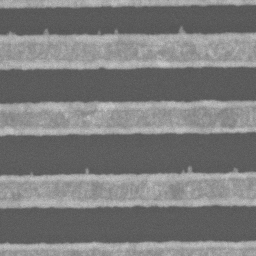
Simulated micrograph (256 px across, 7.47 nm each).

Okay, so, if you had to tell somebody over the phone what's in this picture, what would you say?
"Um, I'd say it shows lines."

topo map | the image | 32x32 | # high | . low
##########################...#..
................................
................................
................................
..........#..######.############
################################
################################
################################
#..#......#.....................
................................
................................
................................
................................
################################
################################
################################
#####################.#..##.....
................................
................................
................................
................................
................................
################################
################################
################################
################################
................................
................................
................................
................................
...........##.....##############
################################